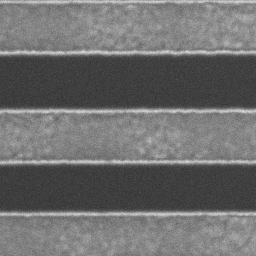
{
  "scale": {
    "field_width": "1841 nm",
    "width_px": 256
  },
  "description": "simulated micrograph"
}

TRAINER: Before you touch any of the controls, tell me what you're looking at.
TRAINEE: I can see lines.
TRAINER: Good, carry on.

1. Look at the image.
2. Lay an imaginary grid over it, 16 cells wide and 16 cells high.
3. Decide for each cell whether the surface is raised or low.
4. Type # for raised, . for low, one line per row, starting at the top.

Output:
................
................
................
################
################
################
################
................
................
................
################
################
################
................
................
................